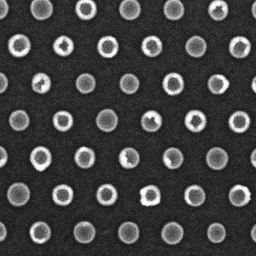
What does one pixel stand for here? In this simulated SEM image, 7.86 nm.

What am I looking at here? a regular array of raised bodies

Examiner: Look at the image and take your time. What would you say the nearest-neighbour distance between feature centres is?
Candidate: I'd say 0.337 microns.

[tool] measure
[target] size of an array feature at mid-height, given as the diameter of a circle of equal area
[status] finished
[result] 160 nanometres